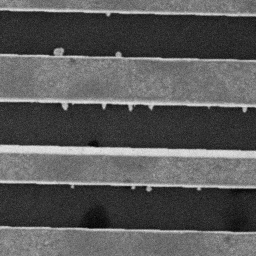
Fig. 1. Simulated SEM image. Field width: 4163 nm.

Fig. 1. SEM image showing lines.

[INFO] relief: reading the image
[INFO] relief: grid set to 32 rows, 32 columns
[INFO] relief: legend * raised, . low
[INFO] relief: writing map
********************************
...........*********************
................................
................................
................................
................................
................................
******************************..
********************************
********************************
********************************
********************************
********************************
................................
................................
................................
................................
................................
................................
********************************
********************************
********************************
********************************
................................
................................
................................
................................
................................
*******.........................
********************************
********************************
********************************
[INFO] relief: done